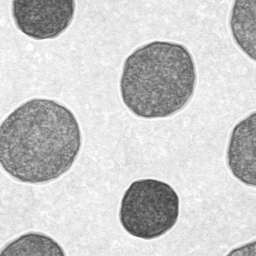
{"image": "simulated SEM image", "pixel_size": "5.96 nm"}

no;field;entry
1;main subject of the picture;holes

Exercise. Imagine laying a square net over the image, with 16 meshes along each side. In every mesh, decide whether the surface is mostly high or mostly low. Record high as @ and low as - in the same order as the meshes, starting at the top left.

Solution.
@----@@@@@@@@@--
@---@@@@@@@@@@--
@@@@@@@@@@@@@@@-
@@@@@@@@----@@@-
@@@@@@@@----@@@@
@@@@@@@@----@@@@
@---@@@@----@@@@
-----@@@@@@@@@@-
-----@@@@@@@@@--
-----@@@@@@@@@--
----@@@@@@@@@@--
@@@@@@@@--@@@@@-
@@@@@@@@---@@@@@
@@@@@@@@---@@@@@
@@@@@@@@--@@@@@@
----@@@@@@@@@@@-